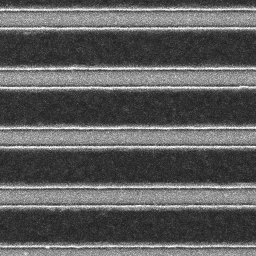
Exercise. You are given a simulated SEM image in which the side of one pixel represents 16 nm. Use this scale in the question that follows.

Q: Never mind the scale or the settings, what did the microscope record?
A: parallel lines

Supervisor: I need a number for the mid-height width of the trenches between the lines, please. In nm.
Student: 280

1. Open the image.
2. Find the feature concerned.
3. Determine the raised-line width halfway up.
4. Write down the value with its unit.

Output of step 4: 659 nanometers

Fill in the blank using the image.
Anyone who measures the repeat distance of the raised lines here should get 950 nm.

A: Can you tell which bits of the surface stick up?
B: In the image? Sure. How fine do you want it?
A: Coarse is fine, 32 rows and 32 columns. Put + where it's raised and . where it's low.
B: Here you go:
++++++++++++++++++++++++++++++++
................................
................................
.....+.....................+++++
++++++++++++++++++++++++++++++++
++++++++++++++++++++++++++++++++
++++++++++++++++++++++++++++++++
++++++++++++++++++++++++++++++++
++++++++++++++++++++++++++++++++
................................
................................
++++++++++++++++++++++++++++++++
++++++++++++++++++++++++++++++++
++++++++++++++++++++++++++++++++
++++++++++++++++++++++++++++++++
++++++++++++++++++++++++++++++++
................................
................................
++++++++++++++++++++++++++++++++
++++++++++++++++++++++++++++++++
++++++++++++++++++++++++++++++++
++++++++++++++++++++++++++++++++
++++++++++++++++++++++++++++++++
.+++++..........................
................................
................................
++++++++++++++++++++++++++++++++
++++++++++++++++++++++++++++++++
++++++++++++++++++++++++++++++++
++++++++++++++++++++++++++++++++
++++++++++++++++++++++++++++++++
................................